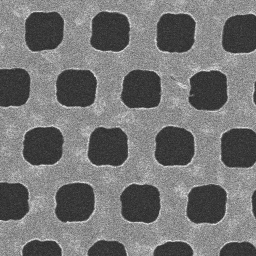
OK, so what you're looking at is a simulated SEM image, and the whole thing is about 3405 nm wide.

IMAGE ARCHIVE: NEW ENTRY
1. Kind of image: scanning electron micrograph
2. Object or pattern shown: a regular array of holes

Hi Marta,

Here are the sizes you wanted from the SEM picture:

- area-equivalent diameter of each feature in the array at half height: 0.55 microns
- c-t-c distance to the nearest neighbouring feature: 869 nm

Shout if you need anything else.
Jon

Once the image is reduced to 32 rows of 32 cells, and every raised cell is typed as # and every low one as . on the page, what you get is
################################
######.#########################
###.....####....####....####....
###.....###.....####....####....
###.....###.....###.....####....
###....####.....####....####....
#####################..#####...#
################################
################################
....###.....####....####....####
....###.....###.....####....####
....###.....###.....####....####
...####.....###.....####....####
########################....####
################################
################################
###.....####...#####....####....
###.....###.....###.....####....
###.....###.....###.....####....
###.....###.....###.....####....
####...#####...#####...#####....
################################
################################
...#####....####...#####....####
....###.....###.....####....####
....###.....###.....###.....###.
...####.....###.....###.....####
..#####....#####...#####....####
################################
################################
###....#####...#####...#####...#
###.....###.....###.....###.....